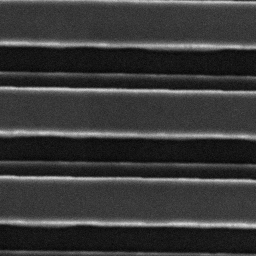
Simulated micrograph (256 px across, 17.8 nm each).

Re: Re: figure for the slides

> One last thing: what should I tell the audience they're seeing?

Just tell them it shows lines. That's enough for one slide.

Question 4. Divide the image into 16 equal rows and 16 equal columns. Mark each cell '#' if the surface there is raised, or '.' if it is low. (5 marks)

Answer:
################
################
################
................
................
#...............
################
################
..............##
................
................
################
################
################
................
................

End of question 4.